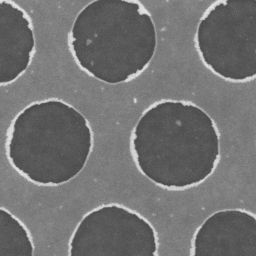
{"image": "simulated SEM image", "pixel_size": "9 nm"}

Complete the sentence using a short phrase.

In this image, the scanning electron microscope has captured holes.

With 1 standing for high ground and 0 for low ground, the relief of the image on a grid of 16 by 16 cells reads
0111100001111000
0011100000111000
0011100000110000
0011100001111000
0111110011111100
1111111111111111
1100111111011111
1000011110000111
1000001100000011
1000001110000011
1000011110000111
1111111111001111
1111111111111111
0111100001111000
0011100000110000
0011000000110000